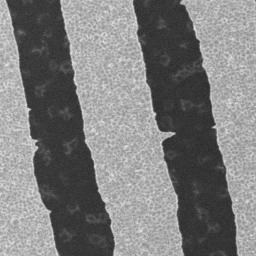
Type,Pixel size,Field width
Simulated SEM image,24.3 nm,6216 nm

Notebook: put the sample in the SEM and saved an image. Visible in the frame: one or a few lines or trenches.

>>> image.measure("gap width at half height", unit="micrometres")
1.32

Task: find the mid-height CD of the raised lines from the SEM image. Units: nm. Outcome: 1700